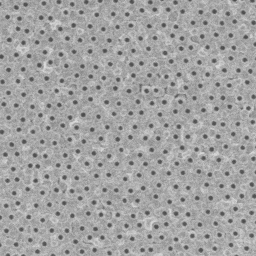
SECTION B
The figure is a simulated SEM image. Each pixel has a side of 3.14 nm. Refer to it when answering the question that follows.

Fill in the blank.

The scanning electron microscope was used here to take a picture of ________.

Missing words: a regular array of holes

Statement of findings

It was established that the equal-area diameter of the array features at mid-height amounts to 0.0166 micrometres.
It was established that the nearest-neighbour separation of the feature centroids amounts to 10.7 px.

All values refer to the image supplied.